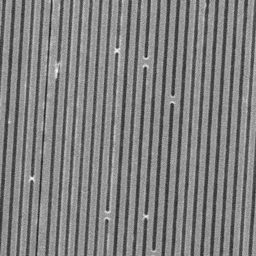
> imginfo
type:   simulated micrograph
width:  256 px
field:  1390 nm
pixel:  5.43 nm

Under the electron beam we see parallel lines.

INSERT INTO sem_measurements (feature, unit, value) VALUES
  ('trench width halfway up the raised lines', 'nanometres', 21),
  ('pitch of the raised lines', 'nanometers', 52.5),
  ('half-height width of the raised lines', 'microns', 0.0312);